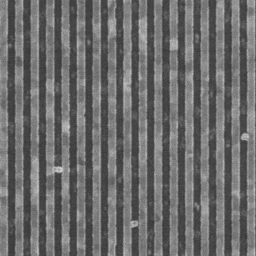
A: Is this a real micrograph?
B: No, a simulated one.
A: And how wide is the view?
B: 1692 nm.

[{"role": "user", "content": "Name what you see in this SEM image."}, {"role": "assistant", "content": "parallel lines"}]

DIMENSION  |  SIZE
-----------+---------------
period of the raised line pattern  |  15.4 pixels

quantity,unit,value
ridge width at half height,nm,45.4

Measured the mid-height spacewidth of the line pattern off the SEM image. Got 57 nm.